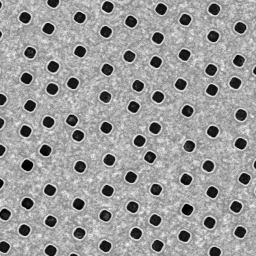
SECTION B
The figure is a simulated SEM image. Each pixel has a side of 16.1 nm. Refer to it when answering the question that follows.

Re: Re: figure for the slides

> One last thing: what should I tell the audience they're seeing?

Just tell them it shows a regular array of holes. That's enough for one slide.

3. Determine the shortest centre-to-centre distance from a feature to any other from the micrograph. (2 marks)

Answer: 416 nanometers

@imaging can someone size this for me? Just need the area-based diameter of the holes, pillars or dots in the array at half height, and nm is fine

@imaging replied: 191